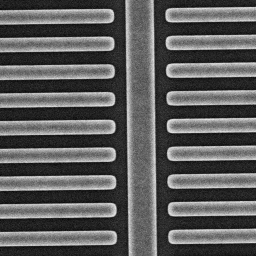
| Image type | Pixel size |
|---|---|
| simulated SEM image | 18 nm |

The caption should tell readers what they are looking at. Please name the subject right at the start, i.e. groups of lines, slits or small figures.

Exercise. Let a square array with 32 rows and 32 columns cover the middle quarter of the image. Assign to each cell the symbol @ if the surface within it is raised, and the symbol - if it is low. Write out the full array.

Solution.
@@@@@@@@@@@@----@@@@@@----@@@@@@
@@@@@@@@@@@@----@@@@@@----@@@@@@
@@@@@@@@@@@@----@@@@@@----@@@@@@
@@@@@@@@@@@@----@@@@@@----------
----------------@@@@@@----------
----------------@@@@@@----------
----------------@@@@@@----------
@@@@@@@@@@@@----@@@@@@@---@@@@@@
@@@@@@@@@@@@@---@@@@@@@---@@@@@@
@@@@@@@@@@@@@---@@@@@@@---@@@@@@
@@@@@@@@@@@@----@@@@@@@---------
----------------@@@@@@@---------
----------------@@@@@@@---------
----------------@@@@@@@---------
@@@@@@@@@@@@----@@@@@@@---@@@@@@
@@@@@@@@@@@@@---@@@@@@@---@@@@@@
@@@@@@@@@@@@@---@@@@@@@---@@@@@@
@@@@@@@@@@------@@@@@@@---------
----------------@@@@@@@---------
----------------@@@@@@@---------
----------------@@@@@@@---------
@@@@@@@@@@@@----@@@@@@@---@@@@@@
@@@@@@@@@@@@@---@@@@@@@---@@@@@@
@@@@@@@@@@@@@---@@@@@@@---@@@@@@
@@@@@-----------@@@@@@@---------
----------------@@@@@@@---------
----------------@@@@@@@---------
----------------@@@@@@@---------
@@@@@@@@@@@@@---@@@@@@@---@@@@@@
@@@@@@@@@@@@@---@@@@@@@---@@@@@@
@@@@@@@@@@@@@---@@@@@@@---@@@@@@
----------------@@@@@@@---------